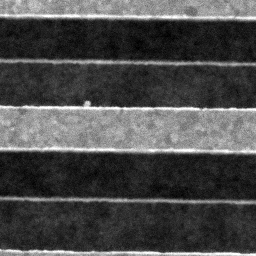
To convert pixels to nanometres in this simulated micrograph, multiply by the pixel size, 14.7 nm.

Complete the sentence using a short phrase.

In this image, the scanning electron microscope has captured lines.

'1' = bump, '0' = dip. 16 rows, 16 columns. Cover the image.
1111111111111111
0000000000000000
0000000000000000
0000000000000000
1111111111111111
1111111111111111
1111111111111111
1111111111111111
1111111111111111
0000000000000000
0000000000000000
0000000000000000
1110000000000000
1111111111111111
1111111111111111
1111111111111111